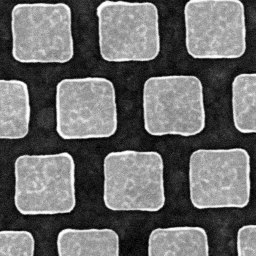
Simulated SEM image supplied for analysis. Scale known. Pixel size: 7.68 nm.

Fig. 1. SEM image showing raised bodies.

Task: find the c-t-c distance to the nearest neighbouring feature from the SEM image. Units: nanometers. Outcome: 663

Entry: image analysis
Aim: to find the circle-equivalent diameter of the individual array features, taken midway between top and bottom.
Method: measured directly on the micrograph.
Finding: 495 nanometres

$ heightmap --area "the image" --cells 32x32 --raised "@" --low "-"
---------------@@@@-----@@@@@@--
--@@@@@@@---@@@@@@@@---@@@@@@@--
--@@@@@@@---@@@@@@@@---@@@@@@@--
--@@@@@@@---@@@@@@@@---@@@@@@@@-
--@@@@@@@---@@@@@@@@---@@@@@@@@-
--@@@@@@@---@@@@@@@@---@@@@@@@@-
--@@@@@@@----@@@@@@@----@@@@@@--
--@@@@@@-----@@--@@-------------
--------------------------------
------------------------------@@
@@@-----@@@@@@----@@@@@@@----@@@
@@@----@@@@@@@----@@@@@@@----@@@
@@@----@@@@@@@----@@@@@@@----@@@
@@@----@@@@@@@----@@@@@@@----@@@
@@@----@@@@@@@----@@@@@@@@---@@@
@@@----@@@@@@@----@@@@@@@----@@@
@@@----@@@@@@@-----@@@@@@-------
--------------------------------
--------------------------------
---@--@@@----@@@@@@@----@@@@@@@-
--@@@@@@@----@@@@@@@----@@@@@@@-
--@@@@@@@----@@@@@@@----@@@@@@@-
--@@@@@@@----@@@@@@@----@@@@@@@-
--@@@@@@@----@@@@@@@----@@@@@@@-
--@@@@@@@----@@@@@@@----@@@@@@@-
--@@@@@@@----@@@@@@@----@@@@@@@-
---@@@@@------------------------
--------------------------------
----------------------@@------@@
@@@@---@@@@@@@@----@@@@@@@----@@
@@@@---@@@@@@@@----@@@@@@@----@@
@@@@---@@@@@@@@----@@@@@@@----@@